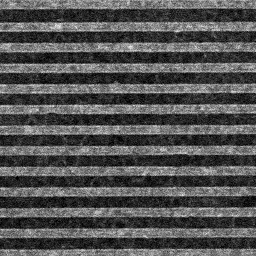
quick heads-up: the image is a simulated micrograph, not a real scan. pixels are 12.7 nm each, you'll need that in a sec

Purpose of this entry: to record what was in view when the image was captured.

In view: parallel lines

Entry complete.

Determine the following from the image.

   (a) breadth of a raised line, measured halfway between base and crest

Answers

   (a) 94.9 nm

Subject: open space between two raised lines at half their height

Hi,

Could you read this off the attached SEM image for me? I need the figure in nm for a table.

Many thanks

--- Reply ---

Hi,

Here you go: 166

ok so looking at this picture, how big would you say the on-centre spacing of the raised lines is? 262 nm